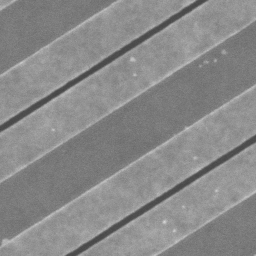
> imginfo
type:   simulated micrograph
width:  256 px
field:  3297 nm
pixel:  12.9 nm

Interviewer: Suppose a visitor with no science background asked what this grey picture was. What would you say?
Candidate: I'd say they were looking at lines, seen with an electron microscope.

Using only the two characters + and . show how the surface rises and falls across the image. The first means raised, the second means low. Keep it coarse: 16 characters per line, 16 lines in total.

.......+++++++++
.....+++++++++++
...+++++++++++..
..++++++++++....
+++++++++++.....
+++++++++.......
++.+++++......++
++++++.......+++
+++++......+++++
+++......+++++.+
+.......++++++++
......++++++++++
.....++++++++++.
...+++++.+++++..
.+++++++++++....
+++++++++++.....